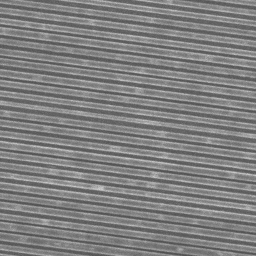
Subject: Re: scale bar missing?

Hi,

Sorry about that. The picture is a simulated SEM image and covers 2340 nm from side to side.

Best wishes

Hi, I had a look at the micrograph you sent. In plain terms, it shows parallel lines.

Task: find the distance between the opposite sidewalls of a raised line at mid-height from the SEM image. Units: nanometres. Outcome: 51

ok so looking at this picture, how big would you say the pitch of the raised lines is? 93.1 nm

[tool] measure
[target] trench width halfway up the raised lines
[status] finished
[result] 41.9 nm